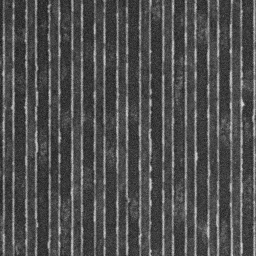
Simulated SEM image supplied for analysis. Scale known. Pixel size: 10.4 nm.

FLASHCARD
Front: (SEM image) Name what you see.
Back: parallel lines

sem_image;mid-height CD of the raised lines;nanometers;114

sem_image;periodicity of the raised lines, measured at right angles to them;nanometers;238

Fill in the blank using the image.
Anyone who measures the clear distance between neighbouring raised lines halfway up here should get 123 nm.